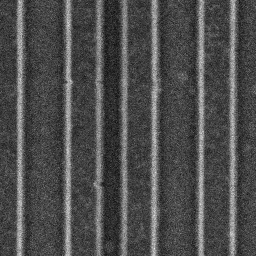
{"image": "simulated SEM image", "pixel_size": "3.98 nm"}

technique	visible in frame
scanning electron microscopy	one or a few lines or trenches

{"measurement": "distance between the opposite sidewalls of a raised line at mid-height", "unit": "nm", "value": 123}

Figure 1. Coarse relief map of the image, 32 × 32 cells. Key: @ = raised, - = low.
@@@------@@@---@@@@------@@@@---
@@@------@@@----@@@------@@@@---
@@@------@@@----@@@------@@@@---
@@@------@@@----@@@------@@@@---
@@@------@@@----@@@------@@@@---
@@@------@@@----@@@------@@@@---
@@@------@@@----@@@------@@@@---
@@@------@@@----@@@------@@@@---
@@@------@@@----@@@------@@@@---
@@@------@@@----@@@------@@@@---
@@@------@@@----@@@------@@@@---
@@@------@@@----@@@------@@@@---
@@@------@@@----@@@------@@@@---
@@@------@@@----@@@------@@@@---
@@-------@@@----@@@------@@@@---
@@-------@@@----@@@------@@@@---
@@-------@@@----@@@------@@@@---
@@-------@@@----@@@------@@@@---
@@-------@@@----@@@------@@@@---
@@-------@@@---@@@@------@@@@---
@@-------@@@----@@@------@@@@---
@@-------@@@----@@@------@@@@---
@@-------@@@----@@@------@@@@---
@@-------@@@----@@@------@@@@---
@@-------@@@----@@@------@@@@---
@@-------@@@----@@@------@@@@---
@@-------@@@----@@@------@@@@---
@@-------@@@----@@@------@@@@---
@@-------@@@----@@@------@@@@---
@@-------@@@----@@@------@@@@---
@@-------@@@---@@@@------@@@@---
@@-------@@@---@@@@------@@@@---